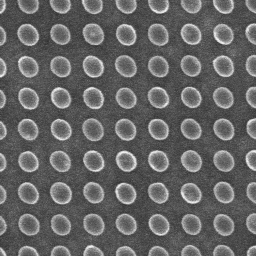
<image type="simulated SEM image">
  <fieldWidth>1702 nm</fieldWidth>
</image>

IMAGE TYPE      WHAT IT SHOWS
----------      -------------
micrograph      a regular array of raised bodies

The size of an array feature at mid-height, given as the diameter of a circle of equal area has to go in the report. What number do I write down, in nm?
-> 136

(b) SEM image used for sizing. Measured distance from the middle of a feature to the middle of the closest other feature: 0.21 micrometres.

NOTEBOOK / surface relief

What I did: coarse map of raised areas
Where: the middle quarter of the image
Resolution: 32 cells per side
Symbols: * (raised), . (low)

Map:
*....*****...*****...*****...***
*....*****...*****...*****....**
*.....***.....****....****.....*
................................
................................
................................
......***.....***.....***.....**
*....****....****....*****....**
*....*****...*****...*****....**
*....*****...*****...*****....**
*.....***.....***.....***......*
................................
................................
................................
*....****....****.....***.....**
*....****....*****...*****...***
**...*****...*****...*****...***
**...*****...*****....****....**
*.....***.....***......**......*
................................
................................
................................
.....****.....***.....***.....**
*....*****...*****...*****...***
*....*****...*****...*****....**
*.....****....****....****....**
*......**......**......**......*
................................
................................
................................
*....****.....***.....***.....**
**...*****...*****...*****...***